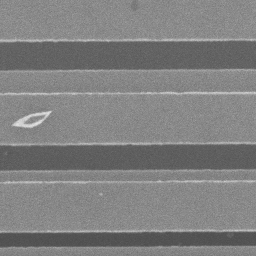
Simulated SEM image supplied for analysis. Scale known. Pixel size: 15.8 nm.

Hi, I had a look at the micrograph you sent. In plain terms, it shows lines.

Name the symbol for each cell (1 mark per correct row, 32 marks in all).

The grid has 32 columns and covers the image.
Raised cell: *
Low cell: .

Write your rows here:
********************************
********************************
********************************
********************************
********************************
................................
................................
................................
................................
********************************
********************************
********************************
********************************
********************************
********************************
********************************
********************************
********************************
................................
................................
................................
********************************
********************************
********************************
********************************
********************************
********************************
********************************
********************************
................................
................................
********************************